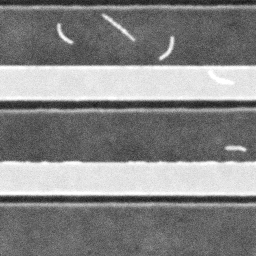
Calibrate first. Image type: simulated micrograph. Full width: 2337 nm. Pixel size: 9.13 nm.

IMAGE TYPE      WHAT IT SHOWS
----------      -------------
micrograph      lines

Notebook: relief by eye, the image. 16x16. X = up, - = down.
----------------
----------------
----------------
----------------
XXXXXXXXXXXXXXXX
XXXXXXXXXXXXXXXX
----------------
----------------
----------------
----------------
XXXXXXXXXXXXXXXX
XXXXXXXXXXXXXXXX
----------------
----------------
----------------
----------------